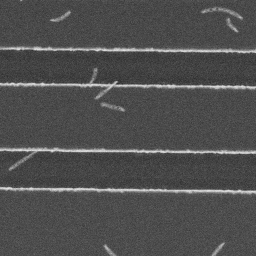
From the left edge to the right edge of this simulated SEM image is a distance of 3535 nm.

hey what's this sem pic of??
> lines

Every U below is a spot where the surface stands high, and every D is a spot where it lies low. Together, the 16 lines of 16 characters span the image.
UUUUUUUUUUUUUUUU
UUUUUUUUUUUUUUUU
UUUUUUUUUUUUUUUU
DDDDDDDDDDDDDDDD
DDDDDDDDDDDDDDDD
UUUUUUUUUUUUUUUU
UUUUUUUUUUUUUUUU
UUUUUUUUUUUUUUUU
UUUUUUUUUUUUUUUU
DDDDDDDDUUUUUUUU
DDDDDDDDDDDDDDDD
DDDDDDDDDDDDDDDD
UUUUUUUUUUUUUUUU
UUUUUUUUUUUUUUUU
UUUUUUUUUUUUUUUU
UUUUUUUUUUUUUUUU